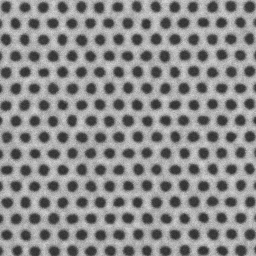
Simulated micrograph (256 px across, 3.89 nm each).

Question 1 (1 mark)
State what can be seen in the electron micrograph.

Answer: a regular array of holes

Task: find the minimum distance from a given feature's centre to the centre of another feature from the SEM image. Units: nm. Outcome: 70.8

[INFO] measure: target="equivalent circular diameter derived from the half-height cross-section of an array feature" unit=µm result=0.0441